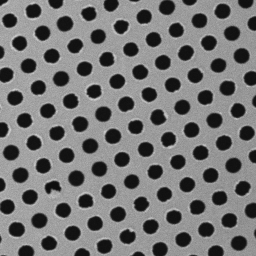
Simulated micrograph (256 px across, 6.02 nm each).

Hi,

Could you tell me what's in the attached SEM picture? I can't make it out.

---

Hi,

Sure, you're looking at a regular array of holes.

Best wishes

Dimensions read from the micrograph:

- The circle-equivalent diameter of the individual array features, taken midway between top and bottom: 15 px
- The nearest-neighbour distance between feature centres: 146 nanometers